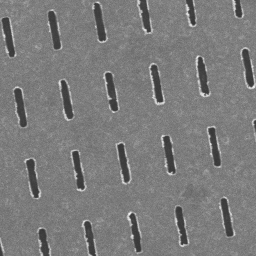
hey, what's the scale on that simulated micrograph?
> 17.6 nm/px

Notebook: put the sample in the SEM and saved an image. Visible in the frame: a regular array of holes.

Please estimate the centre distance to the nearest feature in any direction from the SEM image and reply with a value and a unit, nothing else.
810 nanometres